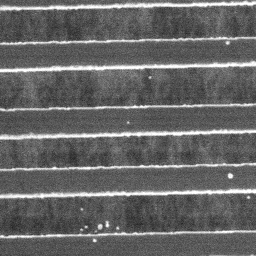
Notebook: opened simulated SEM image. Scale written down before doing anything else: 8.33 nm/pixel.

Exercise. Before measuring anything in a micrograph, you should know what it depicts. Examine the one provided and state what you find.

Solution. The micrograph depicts lines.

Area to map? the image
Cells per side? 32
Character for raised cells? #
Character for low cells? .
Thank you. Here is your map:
###########################.#...
................................
................................
................................
................................
################################
################################
################################
##############..................
................................
................................
................................
................................
............####################
################################
################################
###########################.....
................................
................................
................................
................................
################################
################################
################################
######..........................
................................
................................
................................
................................
.....###########################
################################
################################